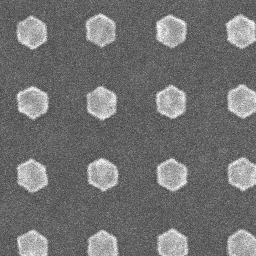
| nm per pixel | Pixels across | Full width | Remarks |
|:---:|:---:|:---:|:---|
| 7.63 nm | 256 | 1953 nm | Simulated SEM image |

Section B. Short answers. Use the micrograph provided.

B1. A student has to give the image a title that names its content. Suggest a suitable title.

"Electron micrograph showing a regular array of raised bodies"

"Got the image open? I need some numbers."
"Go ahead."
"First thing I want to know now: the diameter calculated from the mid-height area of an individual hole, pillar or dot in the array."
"225 nm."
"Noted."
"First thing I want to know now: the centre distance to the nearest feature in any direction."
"528 nm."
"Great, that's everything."